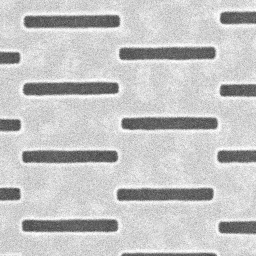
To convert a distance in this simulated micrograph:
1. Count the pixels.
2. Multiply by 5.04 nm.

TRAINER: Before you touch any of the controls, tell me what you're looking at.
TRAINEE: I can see holes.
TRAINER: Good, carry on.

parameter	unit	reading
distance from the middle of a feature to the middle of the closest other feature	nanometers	348